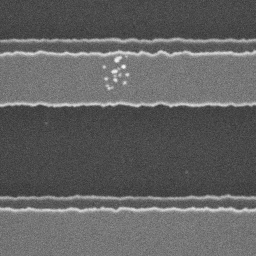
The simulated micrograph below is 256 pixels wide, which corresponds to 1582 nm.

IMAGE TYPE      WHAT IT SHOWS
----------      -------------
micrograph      lines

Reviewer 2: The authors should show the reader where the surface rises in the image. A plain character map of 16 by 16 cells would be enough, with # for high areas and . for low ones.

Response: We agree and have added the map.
................
................
................
################
################
################
################
................
................
................
................
................
################
################
################
################